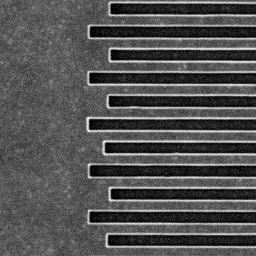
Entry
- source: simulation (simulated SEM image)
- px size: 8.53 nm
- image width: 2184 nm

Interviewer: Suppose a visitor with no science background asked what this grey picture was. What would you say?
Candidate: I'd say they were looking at parallel lines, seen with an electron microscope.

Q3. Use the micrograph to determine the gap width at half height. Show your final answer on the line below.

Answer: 104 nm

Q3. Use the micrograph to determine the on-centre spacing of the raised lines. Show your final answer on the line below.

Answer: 197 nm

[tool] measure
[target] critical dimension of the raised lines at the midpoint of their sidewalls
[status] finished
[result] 97 nm